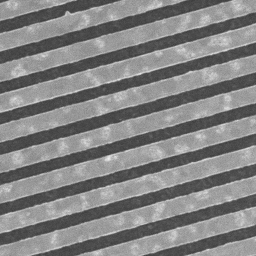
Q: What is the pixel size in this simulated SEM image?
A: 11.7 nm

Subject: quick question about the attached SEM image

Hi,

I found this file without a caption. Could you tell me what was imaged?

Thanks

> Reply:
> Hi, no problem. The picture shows parallel lines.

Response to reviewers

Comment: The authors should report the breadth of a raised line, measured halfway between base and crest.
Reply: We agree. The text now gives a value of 195 nanometers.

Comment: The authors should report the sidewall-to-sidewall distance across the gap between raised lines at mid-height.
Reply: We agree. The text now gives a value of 0.147 um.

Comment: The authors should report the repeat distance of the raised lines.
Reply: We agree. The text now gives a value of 341 nm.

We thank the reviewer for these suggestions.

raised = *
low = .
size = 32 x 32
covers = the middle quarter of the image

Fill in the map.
..........****************......
......*****************.........
...****************...........**
***************............*****
************...........*********
********...........*************
****............***************.
*...........****************....
.........***************........
.....****************...........
.****************............***
*************............*******
**********............**********
******............**************
**.............***************..
...........****************.....
.......****************.........
....***************............*
****************............****
************............********
********............************
*****...........****************
*............****************...
.........****************.......
......****************..........
..****************...........***
**************............******
***********...........**********
*******............*************
***............****************.
...........****************.....
........***************.........